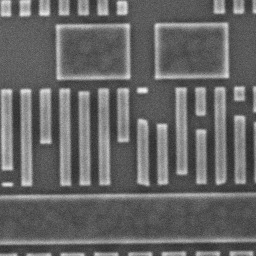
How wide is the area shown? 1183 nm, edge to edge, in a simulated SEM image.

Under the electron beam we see wiring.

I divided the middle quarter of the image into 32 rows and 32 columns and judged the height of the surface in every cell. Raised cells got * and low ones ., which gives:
****************.......*********
****************.......*********
****************.......*********
****************.......******...
................................
................................
*........**...**...**.......***.
*...**...**...**............***.
*...**...**...**............***.
*...**...**...**............***.
*...**...**...**............***.
*...**...**...**............***.
*...**...**...**............***.
*...**...**...**............***.
*...**...**...**...**.......***.
*...**...**...**...**..***..***.
*...**...**...**...**..***..***.
*...**...**...**...**..***..***.
*...**...**...**...**..***..***.
*...**...**........**..***..***.
*...**...**........**..***..***.
*...**...**........**..***..***.
**..**...**........**..***..***.
**..**...**........**..***..***.
**..**...**........**..***..***.
**..**...**........**...**..***.
**..**...**........**...**..***.
**..**...**........**...**......
**..**...**........**...**......
**..**...**........**...**......
................................
................................